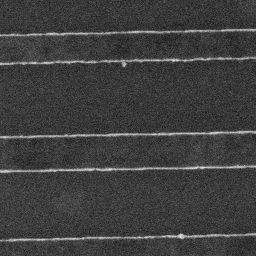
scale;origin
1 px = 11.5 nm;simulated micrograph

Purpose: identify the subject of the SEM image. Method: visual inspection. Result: lines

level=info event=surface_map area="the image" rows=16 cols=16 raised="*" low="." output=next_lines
................
................
****************
****************
................
................
................
................
....************
****************
*************...
................
................
................
................
****************